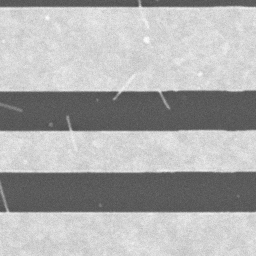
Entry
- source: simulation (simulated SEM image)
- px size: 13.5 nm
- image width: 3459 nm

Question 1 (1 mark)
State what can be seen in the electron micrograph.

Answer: lines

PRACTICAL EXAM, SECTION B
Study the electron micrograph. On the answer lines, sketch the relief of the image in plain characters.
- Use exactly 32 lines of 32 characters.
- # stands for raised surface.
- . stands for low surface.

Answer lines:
................................
################################
################################
################################
################################
################################
################################
################################
################################
################################
################################
................................
................................
................................
................................
................................
################################
################################
################################
################################
################################
................................
................................
................................
................................
................................
.#..............................
################################
################################
################################
################################
################################